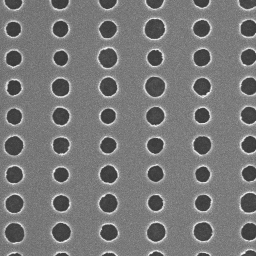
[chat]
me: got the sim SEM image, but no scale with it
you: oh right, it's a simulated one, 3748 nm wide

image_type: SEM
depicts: a regular array of holes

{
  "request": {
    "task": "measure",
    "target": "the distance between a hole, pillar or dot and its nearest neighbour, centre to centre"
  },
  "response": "0.423 micrometres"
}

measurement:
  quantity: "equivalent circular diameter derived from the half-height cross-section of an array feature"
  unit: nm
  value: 252